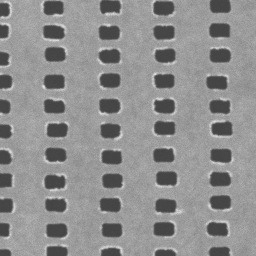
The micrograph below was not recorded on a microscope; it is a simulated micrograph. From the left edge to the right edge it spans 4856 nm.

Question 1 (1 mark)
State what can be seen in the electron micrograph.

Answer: a regular array of holes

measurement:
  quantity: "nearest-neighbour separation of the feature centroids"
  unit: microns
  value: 0.444